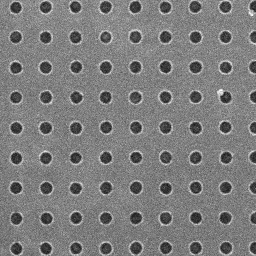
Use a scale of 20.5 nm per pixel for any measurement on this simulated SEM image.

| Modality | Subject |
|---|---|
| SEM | a regular array of holes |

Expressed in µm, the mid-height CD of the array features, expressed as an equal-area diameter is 0.258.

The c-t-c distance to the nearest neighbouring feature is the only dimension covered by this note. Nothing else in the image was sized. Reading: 29.7 px